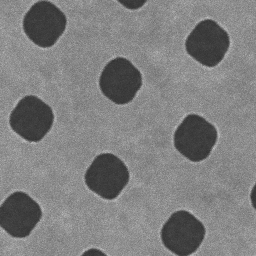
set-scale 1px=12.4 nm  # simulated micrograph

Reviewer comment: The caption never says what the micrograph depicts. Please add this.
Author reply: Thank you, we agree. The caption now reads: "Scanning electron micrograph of holes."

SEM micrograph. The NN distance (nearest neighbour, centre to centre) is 1.17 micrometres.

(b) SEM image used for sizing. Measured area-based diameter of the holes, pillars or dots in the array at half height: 546 nm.